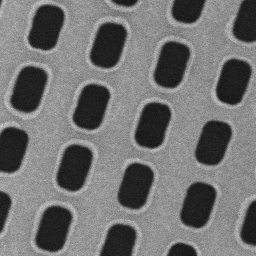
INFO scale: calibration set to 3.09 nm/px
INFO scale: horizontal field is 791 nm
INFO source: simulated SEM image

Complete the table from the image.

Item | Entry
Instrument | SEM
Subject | a regular array of holes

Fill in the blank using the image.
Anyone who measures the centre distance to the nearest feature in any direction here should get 63.6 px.